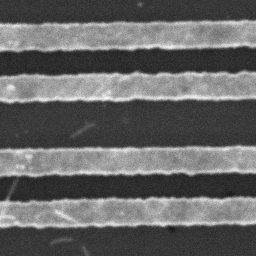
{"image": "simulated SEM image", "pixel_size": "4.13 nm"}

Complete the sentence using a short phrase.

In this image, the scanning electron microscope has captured lines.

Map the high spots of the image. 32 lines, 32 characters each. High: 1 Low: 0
00000000000000000000000000000000
00000000000000000000000000000000
00000000000000000000000000000000
11111111111111111111111111111111
11111111111111111111111111111111
11111111111111111111111111111111
00000000000000000000000000000000
00000000000000000000000000000000
00000000000000000000000000000000
00111101111111111111111111111111
11111111111111111111111111111111
11111111111111111111111111111111
11111111101111110000000000000000
00000000000000000000000000000000
00000000000000000000000000000000
00000000000000000000000000000000
00000000000000000000000000000000
00000000000000000000000000000000
00000000000000000000000111001111
11111111111111111111111111111111
11111111111111111111111111111111
11111111111111111111110111110011
00000000000000000000000000000000
00000000000000000000000000000000
00000000000000000000000000000000
11111111111111111111111111111111
11111111111111111111111111111111
11111111111111111111111111111111
00000000000000000000000000000000
00000000000000000000000000000000
00000000000000000000000000000000
00000000000000000000000000000000